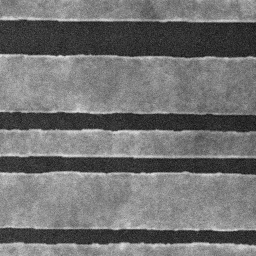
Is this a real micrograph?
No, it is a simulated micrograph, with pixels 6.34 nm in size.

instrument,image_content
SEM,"lines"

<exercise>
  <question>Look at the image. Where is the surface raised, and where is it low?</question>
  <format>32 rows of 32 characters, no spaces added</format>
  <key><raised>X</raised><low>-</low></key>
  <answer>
XXXXXXXXXXXXXXXXXXXXXXXXXXXXXXXX
XXXXXXXXXXXXXXXXXXXXXXXXXXXXXXXX
---------X---XX--XXXXXXXXXXXXXXX
--------------------------------
--------------------------------
--------------------------------
--------------------------------
XXXXXXXXXXXXXXXXXXXXXXXXXXXXXXXX
XXXXXXXXXXXXXXXXXXXXXXXXXXXXXXXX
XXXXXXXXXXXXXXXXXXXXXXXXXXXXXXXX
XXXXXXXXXXXXXXXXXXXXXXXXXXXXXXXX
XXXXXXXXXXXXXXXXXXXXXXXXXXXXXXXX
XXXXXXXXXXXXXXXXXXXXXXXXXXXXXXXX
XXXXXXXXXXXXXXXXXXXXXXXXXXXXXXXX
--------------------------------
--------------------------------
XXXXXXXXXXXXXXXXXXXXXXXXXX------
XXXXXXXXXXXXXXXXXXXXXXXXXXXXXXXX
XXXXXXXXXXXXXXXXXXXXXXXXXXXXXXXX
------------XXXXXXXXXXXXXXXXXXXX
--------------------------------
--------------------------------
XXXXXXXXXXXXXXXXXXXXXXXXXXXXXXXX
XXXXXXXXXXXXXXXXXXXXXXXXXXXXXXXX
XXXXXXXXXXXXXXXXXXXXXXXXXXXXXXXX
XXXXXXXXXXXXXXXXXXXXXXXXXXXXXXXX
XXXXXXXXXXXXXXXXXXXXXXXXXXXXXXXX
XXXXXXXXXXXXXXXXXXXXXXXXXXXXXXXX
-----XXXXXXXXXXXXXXXXXXXXXXXXXXX
--------------------------------
--------------------------------
XXXXXXXXXXXXXXXXXXXXXXXXXXXXXXXX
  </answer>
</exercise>